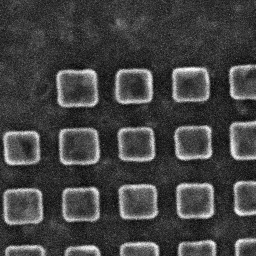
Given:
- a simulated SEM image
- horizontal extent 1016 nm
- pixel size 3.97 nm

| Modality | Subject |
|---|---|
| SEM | a regular array of raised bodies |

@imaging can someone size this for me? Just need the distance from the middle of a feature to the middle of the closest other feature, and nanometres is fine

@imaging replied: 226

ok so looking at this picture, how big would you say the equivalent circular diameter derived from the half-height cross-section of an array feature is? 148 nanometres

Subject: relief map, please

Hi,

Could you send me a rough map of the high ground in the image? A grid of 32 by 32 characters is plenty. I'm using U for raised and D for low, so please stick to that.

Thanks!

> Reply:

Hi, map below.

DDDDDDDDDDDDDDDDDDDDDDDDDDDDDDDD
DDDDDDDDDDDDDDDDDDDDDDDDDDDDDDDD
DDDDDDDDDDDDDDDDDDDDDDDDDDDDDDDD
DDDDDDDDDDDDDDDDDDDDDDDDDDDDDDDD
DDDDDDDDDDDDDDDDDDDDDDDDDDDDDDDD
DDDDDDDDDDDDDDDDDDDDDDDDDDDDDDDD
DDDDDDDDDDDDDDDDDDDDDDDDDDDDDDDD
DDDDDDDDDDDDDDDDDDDDDDDDDDDDDDDD
DDDDDDDDDDDDDDDDDDDDDDDDDDDDDUUU
DDDDDDDUUUUUDDDUUUUDDDUUUUDDDUUU
DDDDDDDUUUUUDDDUUUUDDDUUUUDDDUUU
DDDDDDDUUUUUDDDUUUUDDDUUUUDDDUUU
DDDDDDDUUUUUDDDUUUUDDDUUUUDDDDDD
DDDDDDDDDDDDDDDDDDDDDDDDDDDDDDDD
DDDDDDDDDDDDDDDDDDDDDDDDDDDDDDDD
DDDDDDDDDDDDDDDDDDDDDDDDDDDDDUUU
DDDUDDDDUUUUDDDUUUUDDDUUUUDDDUUU
DUUUUDDDUUUUDDDUUUUDDDUUUUDDDUUU
DUUUUDDDUUUUDDDUUUUDDDUUUUDDDUUU
DUUUUDDDUUUUDDDUUUUDDDUUUUDDDUUU
DDDDDDDDDDUDDDDDDDDDDDDDDDDDDDDD
DDDDDDDDDDDDDDDDDDDDDDDDDDDDDDDD
DDDDDDDDDDDDDDDDDDDDDDDDDDDDDDDD
DDDDDDDDDDDDDDDUUUUDDDUUUUDDDUUU
DUUUUDDDUUUUDDDUUUUDDDUUUUUDDUUU
DUUUUDDDUUUUDDDUUUUDDDUUUUUDDUUU
DUUUUDDDUUUUDDDUUUUDDDUUUUUDDDUU
DUUUUDDDDDUUDDDDDDDDDDDDDDDDDDDD
DDDDDDDDDDDDDDDDDDDDDDDDDDDDDDDD
DDDDDDDDDDDDDDDDDDDDDDDDDDDDDDDD
DDDDDDDDDDDDDDDDUUUDDDDUUUUDDDUU
DUUUUUDDUUUUDDDUUUUUDDUUUUUDDDUU